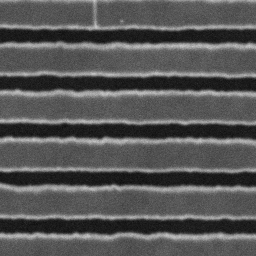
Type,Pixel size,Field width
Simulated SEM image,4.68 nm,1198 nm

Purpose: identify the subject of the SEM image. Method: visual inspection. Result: lines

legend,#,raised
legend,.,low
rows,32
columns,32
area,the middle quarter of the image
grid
################################
################################
################################
................................
................................
................................
................................
################################
################################
################################
################################
################################
################################
################################
################################
................................
................................
................................
.##.......#....................#
################################
################################
################################
################################
################################
################################
################################
#.###.##########################
................................
................................
................................
#....#....####.###..............
################################